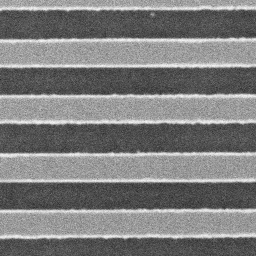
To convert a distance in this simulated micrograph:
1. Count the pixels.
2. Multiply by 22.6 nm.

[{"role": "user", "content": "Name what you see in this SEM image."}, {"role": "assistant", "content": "lines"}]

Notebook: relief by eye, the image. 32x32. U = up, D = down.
UUUUUUUUUUUUUUUUUUUUUUUUUUUUUUUU
DDDDDDDDDDDDDDDDDDDDDDDDDDDDDDDD
DDDDDDDDDDDDDDDDDDDDDDDDDDDDDDDD
DDDDDDDDDDDDDDDDDDDDDDDDDDDDDDDD
DDDDDDDDDDDDDDDDDDDDDDDDDDDDDDDD
UUUUUUUUUUUUUUUUUUUUUUUUUUUUUUUU
UUUUUUUUUUUUUUUUUUUUUUUUUUUUUUUU
UUUUUUUUUUUUUUUUUUUUUUUUUUUUUUUU
DDDDDDDDDDDDDDDDDDDDDDDDDDDDDDDD
DDDDDDDDDDDDDDDDDDDDDDDDDDDDDDDD
DDDDDDDDDDDDDDDDDDDDDDDDDDDDDDDD
DDDDDDDDDDDDDDDDDDDDDDDDDDDDDDDD
UUUUUUUUUUUUUUUUUUUUUUUUUUUUUUUU
UUUUUUUUUUUUUUUUUUUUUUUUUUUUUUUU
UUUUUUUUUUUUUUUUUUUUUUUUUUUUUUUU
DDDDDDDUDDDDDDDDDDDDDDDDDDDDDDDD
DDDDDDDDDDDDDDDDDDDDDDDDDDDDDDDD
DDDDDDDDDDDDDDDDDDDDDDDDDDDDDDDD
DDDDDDDDDDDDDDDDDDDDDDDDDDDDDDDD
UUUUUUUUUUUUUUUUUUUUUUUUUUUUUUUU
UUUUUUUUUUUUUUUUUUUUUUUUUUUUUUUU
UUUUUUUUUUUUUUUUUUUUUUUUUUUUUUUU
UUUUUUUUUUUUUUUUUUUUUUUUUUUUUUUU
DDDDDDDDDDDDDDDDDDDDDDDDDDDDDDDD
DDDDDDDDDDDDDDDDDDDDDDDDDDDDDDDD
DDDDDDDDDDDDDDDDDDDDDDDDDDDDDDDD
UUUUUUUUUUUUUUUUUUUUUUUUUUUUUUUU
UUUUUUUUUUUUUUUUUUUUUUUUUUUUUUUU
UUUUUUUUUUUUUUUUUUUUUUUUUUUUUUUU
UUUUUUUUUUUUUUUUUUUUUUUUUUUUUUUU
DDDDDDDDDDDDDDDDDDDDDDDDDDDDDDDD
DDDDDDDDDDDDDDDDDDDDDDDDDDDDDDDD